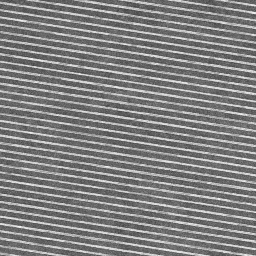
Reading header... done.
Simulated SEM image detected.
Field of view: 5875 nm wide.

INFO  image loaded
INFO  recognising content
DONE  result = parallel lines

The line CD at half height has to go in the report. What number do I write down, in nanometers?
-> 39.7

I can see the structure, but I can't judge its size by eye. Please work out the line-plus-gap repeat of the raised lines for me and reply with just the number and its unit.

167 nanometers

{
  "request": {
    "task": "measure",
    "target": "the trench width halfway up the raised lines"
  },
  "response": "128 nm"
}